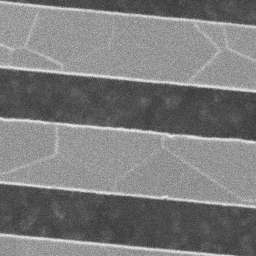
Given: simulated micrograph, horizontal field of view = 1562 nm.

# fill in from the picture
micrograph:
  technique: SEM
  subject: one or a few lines or trenches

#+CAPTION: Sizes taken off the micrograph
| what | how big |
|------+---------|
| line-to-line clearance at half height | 313 nm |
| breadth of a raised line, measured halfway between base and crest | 393 nm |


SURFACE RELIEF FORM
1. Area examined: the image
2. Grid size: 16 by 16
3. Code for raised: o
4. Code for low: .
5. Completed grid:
oooo............
ooooooooooooooo.
oooooooooooooooo
oooooooooooooooo
...ooooooooooooo
..............oo
................
o...............
oooooooooooo....
oooooooooooooooo
oooooooooooooooo
.ooooooooooooooo
...........ooooo
................
................
ooooooooo.......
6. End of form